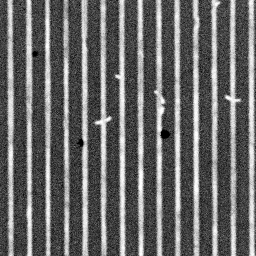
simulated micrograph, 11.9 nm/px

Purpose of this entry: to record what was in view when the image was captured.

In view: parallel lines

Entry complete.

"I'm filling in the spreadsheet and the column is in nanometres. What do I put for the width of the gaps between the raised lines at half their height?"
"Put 187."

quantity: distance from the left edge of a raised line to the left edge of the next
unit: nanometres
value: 220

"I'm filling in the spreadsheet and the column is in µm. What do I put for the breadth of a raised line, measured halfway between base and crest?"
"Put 0.0311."